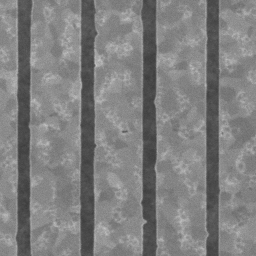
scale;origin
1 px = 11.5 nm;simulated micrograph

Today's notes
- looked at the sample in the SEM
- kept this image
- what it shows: one or a few lines or trenches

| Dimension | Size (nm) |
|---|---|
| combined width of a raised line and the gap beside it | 725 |